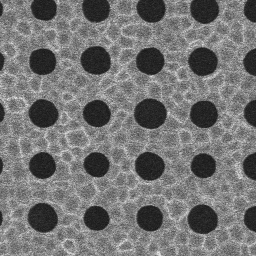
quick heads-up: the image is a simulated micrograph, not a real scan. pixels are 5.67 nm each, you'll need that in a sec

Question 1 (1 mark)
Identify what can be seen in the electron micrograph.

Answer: a regular array of holes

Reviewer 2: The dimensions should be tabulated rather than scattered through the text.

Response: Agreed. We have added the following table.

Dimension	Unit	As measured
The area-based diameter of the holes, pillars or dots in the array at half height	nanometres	159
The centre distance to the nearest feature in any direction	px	52.1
